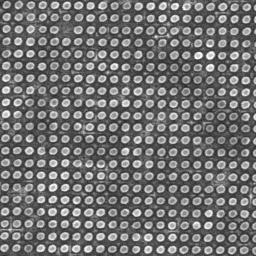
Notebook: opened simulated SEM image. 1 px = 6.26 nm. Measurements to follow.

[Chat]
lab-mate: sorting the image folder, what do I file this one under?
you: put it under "a regular array of raised bodies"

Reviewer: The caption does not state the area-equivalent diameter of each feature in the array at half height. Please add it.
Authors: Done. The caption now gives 45.8 nm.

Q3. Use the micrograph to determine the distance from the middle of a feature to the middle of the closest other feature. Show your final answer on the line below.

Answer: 11.6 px